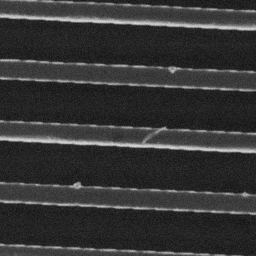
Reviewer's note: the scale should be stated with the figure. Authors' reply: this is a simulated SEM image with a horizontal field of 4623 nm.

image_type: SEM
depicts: lines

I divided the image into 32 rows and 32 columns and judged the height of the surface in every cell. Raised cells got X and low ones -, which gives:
XXXXXXXXXXXXXXX-----------------
XXXXXXXXXXXXXXXXXXXXXXXXXXXXXXXX
---------XXXXXXXXXXXXXXXXXXXXXXX
-----------------------------XXX
--------------------------------
--------------------------------
--------------------------------
--------------------------------
XXXXXXXXXXXXXXXXXXXXXX----------
XXXXXXXXXXXXXXXXXXXXXXXXXXXXXXXX
-------------XXXXXXXXXXXXXXXXXXX
--------------------------------
--------------------------------
--------------------------------
--------------------------------
XXXXXXXX------------------------
XXXXXXXXXXXXXXXXXXXXXXXXXXXX----
---XXXXXXXXXXXXXXXXXXXXXXXXXXXXX
----------------------XXXXXXXXXX
--------------------------------
--------------------------------
--------------------------------
--------------------------------
XXXXXXXXXXXXX-------------------
XXXXXXXXXXXXXXXXXXXXXXXXXXXXXXXX
-----XXXXXXXXXXXXXXXXXXXXXXXXXXX
--------------------------XXXXXX
--------------------------------
--------------------------------
--------------------------------
--------------------------------
XXXXXXXXXXXXXXXXXXXX------------